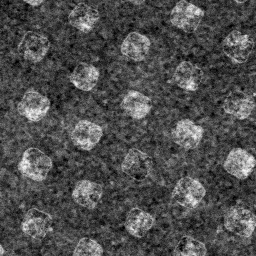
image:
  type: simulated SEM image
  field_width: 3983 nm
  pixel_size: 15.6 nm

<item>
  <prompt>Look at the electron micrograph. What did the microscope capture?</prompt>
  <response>a regular array of holes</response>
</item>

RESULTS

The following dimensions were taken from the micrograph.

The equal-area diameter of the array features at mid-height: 431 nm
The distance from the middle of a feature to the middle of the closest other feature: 904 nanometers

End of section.